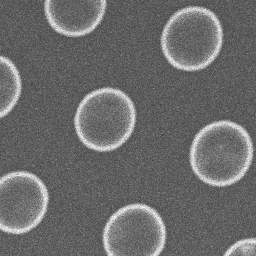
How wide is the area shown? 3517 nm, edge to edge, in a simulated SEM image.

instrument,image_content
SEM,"raised bodies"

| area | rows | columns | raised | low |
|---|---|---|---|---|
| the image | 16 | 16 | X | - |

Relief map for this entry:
---XXX----------
---XXX-----XXX--
----------XXXX--
----------XXX---
X---------------
X---------------
X----XXX--------
-----XXX--------
-----XXX----XXX-
------------XXXX
------------XXX-
XXX-------------
XXX-------------
XXX----XXX------
-------XXX------
-------XXX-----X